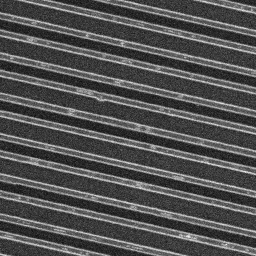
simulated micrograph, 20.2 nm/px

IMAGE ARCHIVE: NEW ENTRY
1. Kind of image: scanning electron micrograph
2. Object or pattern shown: parallel lines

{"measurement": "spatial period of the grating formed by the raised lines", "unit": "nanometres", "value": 394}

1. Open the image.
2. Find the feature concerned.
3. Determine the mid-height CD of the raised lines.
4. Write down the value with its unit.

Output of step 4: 0.13 micrometres